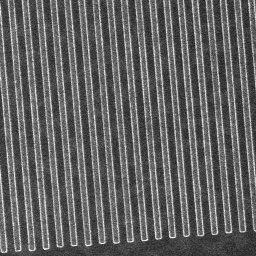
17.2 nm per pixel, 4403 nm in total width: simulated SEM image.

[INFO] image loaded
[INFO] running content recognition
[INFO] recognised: parallel lines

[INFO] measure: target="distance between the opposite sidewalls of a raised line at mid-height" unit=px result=5.6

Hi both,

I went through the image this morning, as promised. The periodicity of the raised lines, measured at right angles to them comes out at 0.242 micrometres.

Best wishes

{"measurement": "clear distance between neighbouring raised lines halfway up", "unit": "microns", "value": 0.146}